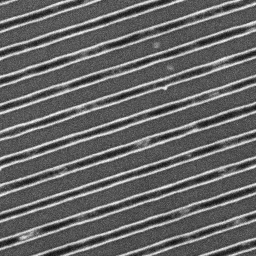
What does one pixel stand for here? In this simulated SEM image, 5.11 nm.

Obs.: parallel lines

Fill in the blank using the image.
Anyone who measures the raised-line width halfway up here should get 0.0498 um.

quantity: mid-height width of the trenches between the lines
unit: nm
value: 84.5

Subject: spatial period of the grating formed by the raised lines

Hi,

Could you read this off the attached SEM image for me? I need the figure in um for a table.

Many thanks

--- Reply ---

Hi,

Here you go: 0.132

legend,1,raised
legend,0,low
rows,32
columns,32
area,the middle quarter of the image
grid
00000000000000111111100000000000
00000000001111111100000000000001
00000001111111100000000000001111
00001111111000000000000000111111
01111111100000000000001111111000
11111000000000000001111111000000
11000000000000001111111000000000
00000000000001111111000000000000
00000000001111111000000000000001
00000001111111000000000000001111
00011111111000000000000011111111
11111110000000000000011111111000
11110000000000000011111111000000
10000000000000001111111000000000
00000000000011111111000000000000
00000000011111110000000000000011
00000011111110000000000000001111
00111111110000000000000011111110
11111110000000000000011111110000
11100000000000000011111110000000
10000000000000111111110000000000
00000000000111111110000000000000
00000000111111110000000000000011
00000111111110000000000000111111
00111111110000000000000111111100
11111110000000000000111111100000
11100000000000000111111100000000
10000000000000111111100000000000
00000000000111111100000000000000
00000000111111100000000000001111
00000111111100000000000000111111
00111111100000000000001111111100